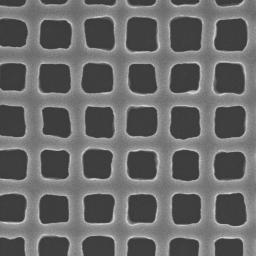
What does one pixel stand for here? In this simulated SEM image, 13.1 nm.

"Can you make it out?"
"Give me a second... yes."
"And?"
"a regular array of holes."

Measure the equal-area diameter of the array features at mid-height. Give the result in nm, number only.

433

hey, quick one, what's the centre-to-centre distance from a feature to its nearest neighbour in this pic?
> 560 nm